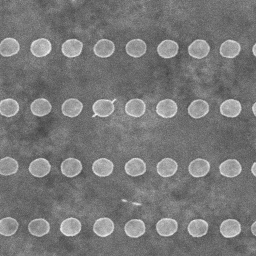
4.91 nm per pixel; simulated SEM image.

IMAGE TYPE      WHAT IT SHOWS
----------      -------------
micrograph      a regular array of raised bodies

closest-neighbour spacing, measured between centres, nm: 154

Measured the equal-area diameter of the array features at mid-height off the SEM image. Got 94.8 nanometres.